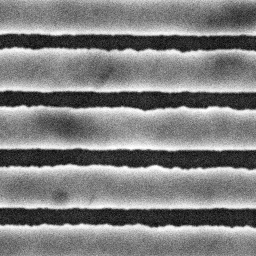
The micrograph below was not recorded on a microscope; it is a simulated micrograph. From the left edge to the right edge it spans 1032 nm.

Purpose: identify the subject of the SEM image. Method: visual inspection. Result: lines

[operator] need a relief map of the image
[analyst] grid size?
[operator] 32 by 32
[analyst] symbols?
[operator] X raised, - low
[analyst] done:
XXXXXXXXXXXXXXXXXXXXXXXXXXXXXXXX
XXXXXXXXXXXXXXXXXXXXXXXXXXXXXXXX
XXXXXXXXXXXXXXXXXXXXXXXXXXXXXXXX
XXXXXXXXXXXXXXXXXXXXXXXXXXXXXXXX
--------------------------------
--------------------------------
XXXXXXXXXXXXXXXXXXXXXXX-XXXXXXXX
XXXXXXXXXXXXXXXXXXXXXXXXXXXXXXXX
XXXXXXXXXXXXXXXXXXXXXXXXXXXXXXXX
XXXXXXXXXXXXXXXXXXXXXXXXXXXXXXXX
XXXXXXXXXXXXXXXXXXXXXXXXXXXXXXXX
---------------------X----------
--------------------------------
XXXXXXX--------X------X---XX----
XXXXXXXXXXXXXXXXXXXXXXXXXXXXXXXX
XXXXXXXXXXXXXXXXXXXXXXXXXXXXXXXX
XXXXXXXXXXXXXXXXXXXXXXXXXXXXXXXX
XXXXXXXXXXXXXXXXXXXXXXXXXXXXXXXX
XXXXXXXXXXXXXXXXXXXXXXXXXXXXXXXX
--------------------------------
--------------------------------
XXXXXXXXXXXXXXXXXXXXXXXXXXXXXXXX
XXXXXXXXXXXXXXXXXXXXXXXXXXXXXXXX
XXXXXXXXXXXXXXXXXXXXXXXXXXXXXXXX
XXXXXXXXXXXXXXXXXXXXXXXXXXXXXXXX
XXXXXXXXXXXXXXXXXXXXXXXXXXXXXXXX
--------------------------------
--------------------------------
XXXXXXXXXXXXXXXXXXXXXXXXXXXXXXXX
XXXXXXXXXXXXXXXXXXXXXXXXXXXXXXXX
XXXXXXXXXXXXXXXXXXXXXXXXXXXXXXXX
XXXXXXXXXXXXXXXXXXXXXXXXXXXXXXXX